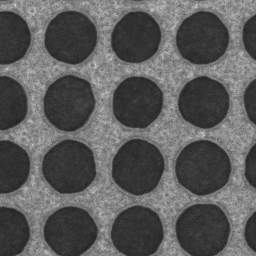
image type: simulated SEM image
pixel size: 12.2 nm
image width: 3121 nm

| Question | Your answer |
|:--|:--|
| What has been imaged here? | a regular array of holes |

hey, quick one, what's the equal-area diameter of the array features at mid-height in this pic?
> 652 nanometres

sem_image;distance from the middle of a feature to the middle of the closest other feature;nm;789